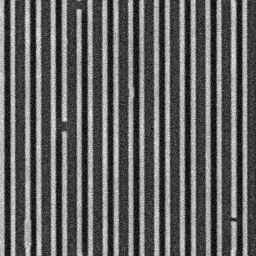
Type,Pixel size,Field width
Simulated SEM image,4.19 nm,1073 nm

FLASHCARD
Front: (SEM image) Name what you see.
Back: parallel lines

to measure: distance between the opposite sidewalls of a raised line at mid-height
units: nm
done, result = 18.3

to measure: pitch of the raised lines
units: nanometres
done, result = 53.9